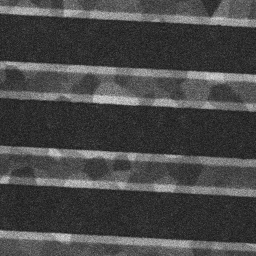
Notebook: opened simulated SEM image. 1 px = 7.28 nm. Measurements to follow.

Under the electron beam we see one or a few lines or trenches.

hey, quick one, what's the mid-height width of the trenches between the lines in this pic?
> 393 nanometers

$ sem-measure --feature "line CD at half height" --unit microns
0.217